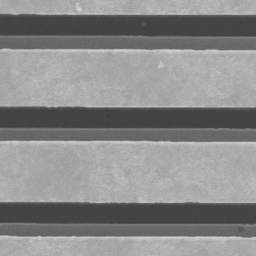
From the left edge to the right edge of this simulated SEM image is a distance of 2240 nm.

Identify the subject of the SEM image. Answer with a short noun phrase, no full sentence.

lines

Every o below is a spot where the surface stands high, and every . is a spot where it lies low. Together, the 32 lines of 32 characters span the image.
oooooooooooooooooooooooooooooooo
oooooooooooooooooooooooooooooooo
................................
................................
................................
oooooooooooooooooooooooooooooooo
oooooooooooooooooooooooooooooooo
oooooooooooooooooooooooooooooooo
oooooooooooooooooooooooooooooooo
oooooooooooooooooooooooooooooooo
oooooooooooooooooooooooooooooooo
oooooooooooooooooooooooooooooooo
oooooooooooooooooooooooooooooooo
................................
................................
................................
oooooooooooooooooooooooooooooooo
oooooooooooooooooooooooooooooooo
oooooooooooooooooooooooooooooooo
oooooooooooooooooooooooooooooooo
oooooooooooooooooooooooooooooooo
oooooooooooooooooooooooooooooooo
oooooooooooooooooooooooooooooooo
oooooooooooooooooooooooooooooooo
oooooooooooooooooooooooooooooooo
................................
................................
................................
oooooooooooooooooooooooooooooooo
oooooooooooooooooooooooooooooooo
oooooooooooooooooooooooooooooooo
oooooooooooooooooooooooooooooooo